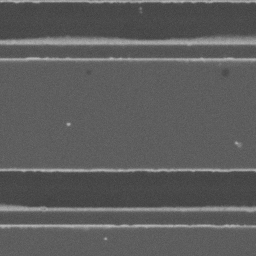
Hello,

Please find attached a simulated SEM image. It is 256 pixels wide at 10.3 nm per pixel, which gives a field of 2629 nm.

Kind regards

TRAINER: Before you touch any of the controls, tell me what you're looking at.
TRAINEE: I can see lines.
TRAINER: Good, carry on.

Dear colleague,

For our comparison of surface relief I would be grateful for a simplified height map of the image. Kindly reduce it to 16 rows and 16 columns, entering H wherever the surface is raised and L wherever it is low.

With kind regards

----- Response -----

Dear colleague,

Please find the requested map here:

LLLLLLLLLLLLLLLL
LLLLLLLLLLLLLLLL
LLLLLLLLLLLLLLLL
HHHHHHHHHHHHHHHH
HHHHHHHHHHHHHHHH
HHHHHHHHHHHHHHHH
HHHHHHHHHHHHHHHH
HHHHHHHHHHHHHHHH
HHHHHHHHHHHHHHHH
HHHHHHHHHHHHHHHH
HHHHHHHHHHHHHHHH
LLLLLLLLLLLLLLLL
LLLLLLLLLLLLLLLL
HHHHHHHHHHHHHHHH
HHHHHHHHHHHHHHHH
HHHHHHHHHHHHHHHH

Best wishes